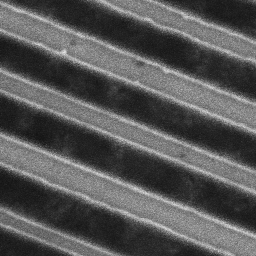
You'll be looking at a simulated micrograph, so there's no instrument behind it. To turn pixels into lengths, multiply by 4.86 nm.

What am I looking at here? one or a few lines or trenches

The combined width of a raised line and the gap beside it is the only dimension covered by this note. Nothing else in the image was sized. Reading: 300 nm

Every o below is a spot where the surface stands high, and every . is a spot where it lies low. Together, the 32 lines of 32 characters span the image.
oooooooooooooo......oooooooooooo
...ooooooooooooo......oooooooooo
.....oooooooooooooo.....oooooooo
........ooooooooooooo......ooooo
oo........oooooooooooooo......oo
ooooo........ooooooooooooo......
oooooooo.......oooooooooooooo...
oooooooooo........oooooooooooooo
oooooooooooo........oooooooooooo
.oooooooooooooo........ooooooooo
....ooooooooooooo........ooooooo
o......ooooooooooooo.......ooooo
ooo......ooooooooooooo........oo
oooooo.....oooooooooooooo.......
oooooooo......ooooooooooooo.....
ooooooooooo......ooooooooooooo..
ooooooooooooo......ooooooooooooo
.ooooooooooooooo.....ooooooooooo
....oooooooooooooo......oooooooo
......ooooooooooooooo.....oooooo
o........oooooooooooooo......ooo
ooo.........oooooooooooooo.....o
oooooo........oooooooooooooo....
oooooooo........ooooooooooooooo.
ooooooooooo........ooooooooooooo
ooooooooooooo........ooooooooooo
.ooooooooooooooo........oooooooo
...ooooooooooooooo.........ooooo
o....oooooooooooooooo........ooo
oooo....ooooooooooooooo.........
oooooo....oooooooooooooooo......
ooooooooo....ooooooooooooooo....